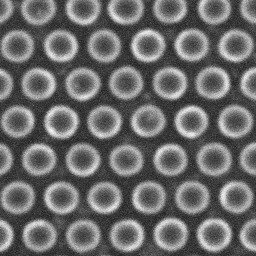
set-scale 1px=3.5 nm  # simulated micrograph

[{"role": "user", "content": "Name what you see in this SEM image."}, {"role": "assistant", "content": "a regular array of raised bodies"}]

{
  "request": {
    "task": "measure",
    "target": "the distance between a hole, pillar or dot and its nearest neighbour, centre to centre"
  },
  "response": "152 nm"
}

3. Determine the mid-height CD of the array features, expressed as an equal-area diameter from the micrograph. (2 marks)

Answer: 0.108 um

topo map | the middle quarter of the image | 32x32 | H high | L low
LLLLLLLLLLLLLLLLLLLLLLLLLLLLLLLL
LLLHHHLLLLLLLLHHHHLLLLLLLHHHLLLL
LLHHHHHHLLLLHHHHHHHLLLLHHHHHHHLL
LHHHHHHHLLLLHHHHHHHLLLLHHHHHHHLL
LHHHHHHHHLLLHHHHHHHLLLLHHHHHHHLL
LHHHHHHHHLLLHHHHHHHLLLLHHHHHHHLL
LHHHHHHHLLLLHHHHHHHLLLLHHHHHHHLL
LHHHHHHHLLLLLHHHHHLLLLLLHHHHHLLL
LLLHHLLLLLLLLLLLLLLLLLLLLLLLLLLL
LLLLLLLLLLLLLLLLLLLLLLLLLLLLLLLL
LLLLLLLLLLLLLLLLLLLLLLLLLLLLLLLL
HLLLLLLLHHHHLLLLLLLHHHHHLLLLLLHH
HHHLLLLHHHHHHLLLLLHHHHHHLLLLLHHH
HHHLLLHHHHHHHHLLLHHHHHHHHLLLHHHH
HHHLLLHHHHHHHHLLLHHHHHHHHLLLHHHH
HHHLLLHHHHHHHHLLLHHHHHHHHLLLHHHH
HHLLLLLHHHHHHLLLLLHHHHHHLLLLLHHH
HHLLLLLLHHHHLLLLLLLHHHHLLLLLLLHH
LLLLLLLLLLLLLLLLLLLLLLLLLLLLLLLL
LLLLLLLLLLLLLLLLLLLLLLLLLLLLLLLL
LLLHHHLLLLLLLLLHLLLLLLLLLLLLLLLL
LLHHHHHHLLLLLHHHHHLLLLLLHHHHHLLL
LHHHHHHHLLLLHHHHHHHLLLLHHHHHHHLL
LHHHHHHHHLLLHHHHHHHLLLLHHHHHHHLL
LHHHHHHHHLLLHHHHHHHLLLLHHHHHHHLL
LHHHHHHHLLLLHHHHHHHLLLLHHHHHHHLL
LLHHHHHHLLLLLHHHHHLLLLLLHHHHHLLL
LLLLHHLLLLLLLLLLLLLLLLLLLLHHLLLL
LLLLLLLLLLLLLLLLLLLLLLLLLLLLLLLL
LLLLLLLLLLLLLLLLLLLLLLLLLLLLLLLL
HHLLLLLLHHHHLLLLLLHHHHHHLLLLLHHH
HHHLLLLHHHHHHHLLLLHHHHHHHLLLLHHH